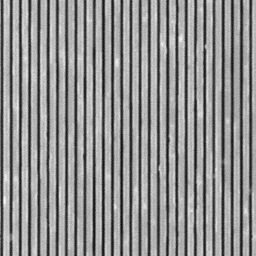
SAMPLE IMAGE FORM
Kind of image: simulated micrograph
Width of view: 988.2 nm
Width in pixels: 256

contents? parallel lines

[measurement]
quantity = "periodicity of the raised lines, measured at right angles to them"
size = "35.6 nm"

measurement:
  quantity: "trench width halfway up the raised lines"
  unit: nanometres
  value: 10.6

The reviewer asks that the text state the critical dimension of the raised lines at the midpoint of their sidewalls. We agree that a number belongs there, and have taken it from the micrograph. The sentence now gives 24.6 nm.